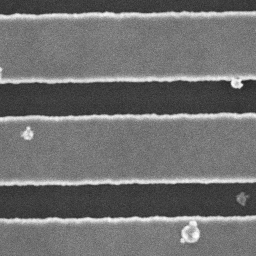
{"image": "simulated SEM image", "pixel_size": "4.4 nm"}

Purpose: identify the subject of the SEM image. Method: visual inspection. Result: lines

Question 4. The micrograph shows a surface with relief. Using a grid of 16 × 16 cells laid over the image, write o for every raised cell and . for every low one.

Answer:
................
oooooooooooooooo
oooooooooooooooo
oooooooooooooooo
oooooooooooooooo
................
................
oooooooooooooooo
oooooooooooooooo
oooooooooooooooo
oooooooooooooooo
oooooooo........
................
................
oooooooooooooooo
oooooooooooooooo